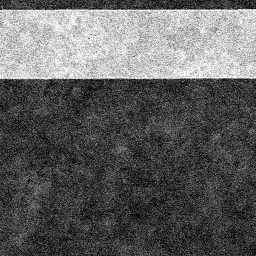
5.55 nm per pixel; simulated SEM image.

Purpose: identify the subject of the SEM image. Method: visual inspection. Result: one or a few lines or trenches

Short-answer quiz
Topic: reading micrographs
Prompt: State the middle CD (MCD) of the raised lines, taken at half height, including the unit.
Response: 378 nm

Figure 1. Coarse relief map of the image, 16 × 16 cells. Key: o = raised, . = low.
................
oooooooooooooooo
oooooooooooooooo
oooooooooooooooo
oooooooooooooooo
................
................
................
................
................
................
................
................
................
................
................